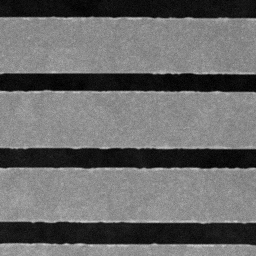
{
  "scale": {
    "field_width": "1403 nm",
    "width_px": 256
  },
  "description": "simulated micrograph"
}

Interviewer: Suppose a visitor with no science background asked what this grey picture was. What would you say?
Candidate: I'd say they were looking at lines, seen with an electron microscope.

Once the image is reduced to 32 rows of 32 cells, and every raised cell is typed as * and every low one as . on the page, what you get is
................................
................................
********************************
********************************
********************************
********************************
********************************
********************************
********************************
................................
................................
*************************.**....
********************************
********************************
********************************
********************************
********************************
********************************
.***.....*..**.*.***************
................................
................................
********************************
********************************
********************************
********************************
********************************
********************************
********************************
................................
................................
................................
********************************